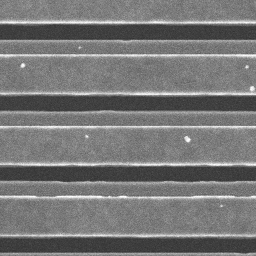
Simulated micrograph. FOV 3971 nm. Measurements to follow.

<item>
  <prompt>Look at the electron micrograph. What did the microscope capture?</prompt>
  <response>lines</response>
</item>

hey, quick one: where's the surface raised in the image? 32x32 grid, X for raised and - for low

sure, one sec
XXXXXXXXXXXXXXXXXXXXXXXXXXXXXXXX
XXXXXXXXXXXXXXXXXXXXXXXXXXXXXXXX
XXXXXXXXXXXXXXXXXXXXXXXXXXXXXXXX
--------------------------------
--------------------------------
XXXXXXXXXXXXXXXXXXXXXXXXXXXXXXXX
XXXXXXXXXXXXXXXXXXXXXXXXXXXXXXXX
XXXXXXXXXXXXXXXXXXXXXXXXXXXXXXXX
XXXXXXXXXXXXXXXXXXXXXXXXXXXXXXXX
XXXXXXXXXXXXXXXXXXXXXXXXXXXXXXXX
XXXXXXXXXXXXXXXXXXXXXXXXXXXXXXXX
XXXXXXXXXXXXXXXXXXXXXXXXXXXXXXXX
--------------------------------
--------------------------------
XXXXXXXXXXXXXXXXXXXXXXXXXXXXXXXX
XXXXXXXXXXXXXXXXXXXXXXXXXXXXXXXX
XXXXXXXXXXXXXXXXXXXXXXXXXXXXXXXX
XXXXXXXXXXXXXXXXXXXXXXXXXXXXXXXX
XXXXXXXXXXXXXXXXXXXXXXXXXXXXXXXX
XXXXXXXXXXXXXXXXXXXXXXXXXXXXXXXX
XXXXXXXXXXXXXXXXXXXXXXXXXXXXXXXX
--------------------------------
--------------------------------
XXXXXXXXXXXXXXXXXXXXXXXXXXXXXXXX
XXXXXXXXXXXXXXXXXXXXXXXXXXXXXXXX
XXXXXXXXXXXXXXXXXXXXXXXXXXXXXXXX
XXXXXXXXXXXXXXXXXXXXXXXXXXXXXXXX
XXXXXXXXXXXXXXXXXXXXXXXXXXXXXXXX
XXXXXXXXXXXXXXXXXXXXXXXXXXXXXXXX
-----X---------XXXXXX-XXX-----XX
--------------------------------
--------------------------------